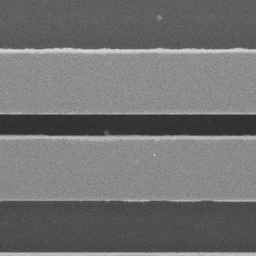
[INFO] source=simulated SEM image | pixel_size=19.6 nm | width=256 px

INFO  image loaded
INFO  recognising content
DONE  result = lines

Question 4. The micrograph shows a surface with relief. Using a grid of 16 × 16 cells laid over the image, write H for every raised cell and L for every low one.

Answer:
LLLLLLLLLLLLLLLL
LLLLLLLLLLLLLLLL
LLLLLLLLLLLLLLLL
HHHHHHHHHHHHHHHH
HHHHHHHHHHHHHHHH
HHHHHHHHHHHHHHHH
HHHHHHHHHHHHHHHH
LLLLLLLLLLLLLLLL
HLLLLLLLLLLLLLLL
HHHHHHHHHHHHHHHH
HHHHHHHHHHHHHHHH
HHHHHHHHHHHHHHHH
HHHHHHHHHHHHHHHH
LLLLLLLLLLLLLLLL
LLLLLLLLLLLLLLLL
LLLLLLLLLLLLLLLL